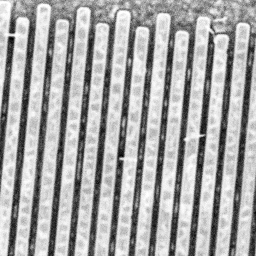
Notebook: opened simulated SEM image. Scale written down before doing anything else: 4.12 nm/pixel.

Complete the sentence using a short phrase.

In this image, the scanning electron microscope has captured parallel lines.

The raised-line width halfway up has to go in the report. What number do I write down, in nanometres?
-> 49.2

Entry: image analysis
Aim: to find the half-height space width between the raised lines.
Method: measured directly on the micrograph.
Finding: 0.0338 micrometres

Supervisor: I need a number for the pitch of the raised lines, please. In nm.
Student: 82.4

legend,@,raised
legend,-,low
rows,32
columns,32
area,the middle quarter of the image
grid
--@@@--@@@--@@@--@@@--@@@--@@@--
--@@@--@@@--@@@--@@@--@@@--@@@--
--@@@--@@@--@@@--@@@--@@@--@@@--
--@@@--@@@--@@@--@@@--@@@--@@@--
--@@@--@@@--@@@--@@@--@@@--@@@--
--@@@--@@@--@@@--@@@--@@@--@@@--
--@@@--@@@--@@---@@@--@@@--@@@--
--@@---@@@--@@---@@---@@@--@@@--
--@@---@@--@@@---@@---@@---@@@--
-@@@---@@--@@@--@@@---@@---@@---
-@@@--@@@--@@@--@@@--@@@---@@---
-@@@--@@@--@@@--@@@--@@@--@@@--@
-@@@--@@@--@@@--@@@--@@@--@@@--@
-@@@--@@@--@@@--@@@--@@@--@@@--@
-@@@--@@@--@@@--@@@--@@@--@@@--@
-@@@--@@@--@@@--@@@--@@@--@@@--@
-@@@--@@@--@@@--@@@--@@@--@@@--@
-@@@--@@@--@@---@@@--@@@--@@@--@
-@@---@@@--@@---@@---@@@--@@@-@@
-@@---@@--@@@---@@---@@---@@---@
@@@---@@--@@@--@@@---@@---@@---@
@@@--@@@--@@@--@@@--@@@--@@@---@
@@@--@@@--@@@--@@@--@@@--@@@--@@
@@@--@@@--@@@--@@@--@@@--@@@--@@
@@@--@@@--@@@--@@@--@@@--@@@--@@
@@@--@@@--@@@--@@@--@@@--@@@--@@
@@@--@@@--@@@--@@@--@@@--@@@--@@
@@@--@@@--@@@--@@@--@@@--@@@--@@
@@@--@@@--@@---@@---@@@--@@@--@@
@@---@@---@@---@@---@@---@@@--@@
@@---@@--@@@--@@@---@@---@@---@@
@@--@@@--@@@--@@@--@@@---@@---@@